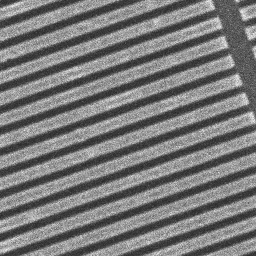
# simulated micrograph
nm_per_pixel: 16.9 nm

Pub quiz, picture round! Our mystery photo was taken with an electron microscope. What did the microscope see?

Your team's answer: parallel lines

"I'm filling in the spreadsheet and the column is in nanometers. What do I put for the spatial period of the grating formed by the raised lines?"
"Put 339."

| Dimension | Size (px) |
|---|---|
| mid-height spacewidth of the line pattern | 8.97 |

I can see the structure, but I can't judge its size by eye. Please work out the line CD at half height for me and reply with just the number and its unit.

0.198 microns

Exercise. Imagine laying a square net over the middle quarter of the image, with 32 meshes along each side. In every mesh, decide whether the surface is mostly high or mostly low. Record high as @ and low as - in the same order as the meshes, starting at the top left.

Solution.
----@@@@@@@@-------@@@@@@@@-----
-@@@@@@@@-------@@@@@@@@@------@
@@@@@@-------@@@@@@@@@------@@@@
@@@-------@@@@@@@@@------@@@@@@@
-------@@@@@@@@@-------@@@@@@@@-
----@@@@@@@@@-------@@@@@@@@----
--@@@@@@@@-------@@@@@@@@-------
@@@@@@@@------@@@@@@@@@------@@@
@@@@@------@@@@@@@@@-------@@@@@
@@------@@@@@@@@@-------@@@@@@@@
-----@@@@@@@@@-------@@@@@@@@---
--@@@@@@@@@-------@@@@@@@@------
@@@@@@@@-------@@@@@@@@-------@@
@@@@@-------@@@@@@@@-------@@@@@
@@-------@@@@@@@@-------@@@@@@@@
------@@@@@@@@@------@@@@@@@@@--
---@@@@@@@@@-------@@@@@@@@-----
-@@@@@@@@-------@@@@@@@@@------@
@@@@@@-------@@@@@@@@@------@@@@
@@@@------@@@@@@@@@------@@@@@@@
@------@@@@@@@@@-------@@@@@@@@-
----@@@@@@@@@-------@@@@@@@@----
-@@@@@@@@--------@@@@@@@@-------
@@@@@@@-------@@@@@@@@-------@@@
@@@@-------@@@@@@@@-------@@@@@@
@@------@@@@@@@@@------@@@@@@@@@
------@@@@@@@@-------@@@@@@@@---
---@@@@@@@@-------@@@@@@@@@-----
@@@@@@@@-------@@@@@@@@-------@@
@@@@@-------@@@@@@@@-------@@@@@
@@-------@@@@@@@@-------@@@@@@@@
------@@@@@@@@-------@@@@@@@@@--